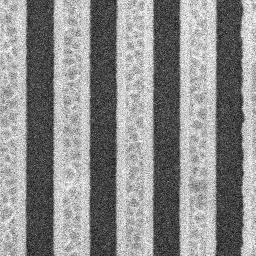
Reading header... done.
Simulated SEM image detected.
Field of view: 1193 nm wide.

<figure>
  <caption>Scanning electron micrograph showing one or a few lines or trenches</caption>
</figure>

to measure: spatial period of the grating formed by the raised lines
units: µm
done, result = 0.294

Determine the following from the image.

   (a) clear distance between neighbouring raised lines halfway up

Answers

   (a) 37 pixels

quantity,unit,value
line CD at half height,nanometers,122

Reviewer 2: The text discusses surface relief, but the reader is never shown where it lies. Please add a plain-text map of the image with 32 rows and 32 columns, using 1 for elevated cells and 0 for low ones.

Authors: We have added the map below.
11100001111000011110000111000001
11100001111000011110000111000001
11100001111000011110000111000001
11100001111000011110000111000001
11100001111000011110000111000001
11100001111000011110000111000001
11100001111000011110000111000001
11100001111000011110000111000001
11100001111000011110000111000001
11100001111000011110000111000001
11100001111000011110000111000001
11100001111000011110000111000001
11100001111000011100000111000001
11100001111000011100000111000001
11100001111000011100000111000001
11100001111000011100000111000001
11100001111000011100000111000001
11100001111000011100000111000001
11100001111000011100000111000001
11100001111000011100000111000001
11100001111000011100000111000001
11100001111000011100000111000001
11100001111000011100000111000001
11100001111000011100000111000001
11100001111000011100000111000001
11100001111000011100000111000001
11100001111000011100000111000001
11100001111000011100000111000001
11100001111000011100000111000001
11100001111000011100000111000001
11100001111000011100000111000001
11100001111000011100000111000001